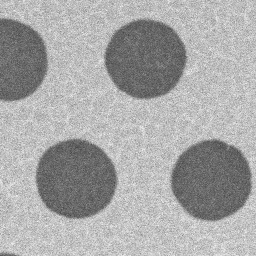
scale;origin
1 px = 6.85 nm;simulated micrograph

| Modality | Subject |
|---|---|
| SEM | holes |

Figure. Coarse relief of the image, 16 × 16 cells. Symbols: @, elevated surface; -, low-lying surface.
@@@@@@@@@@@@@@@@
-@@@@@@@--@@@@@@
---@@@@----@@@@@
---@@@@-----@@@@
---@@@@----@@@@@
--@@@@@----@@@@@
@@@@@@@@@@@@@@@@
@@@@@@@@@@@@@@@@
@@@@@@@@@@@@@@@@
@@@----@@@@@---@
@@-----@@@@-----
@@-----@@@@-----
@@@----@@@@----@
@@@@--@@@@@@--@@
@@@@@@@@@@@@@@@@
@@@@@@@@@@@@@@@@